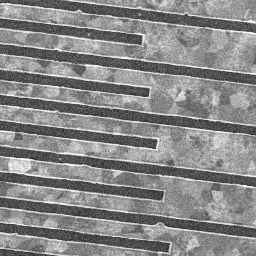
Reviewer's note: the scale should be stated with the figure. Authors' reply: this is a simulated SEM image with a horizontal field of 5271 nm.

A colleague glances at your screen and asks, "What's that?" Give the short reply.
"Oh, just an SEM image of parallel lines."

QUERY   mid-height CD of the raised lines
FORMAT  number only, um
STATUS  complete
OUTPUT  0.296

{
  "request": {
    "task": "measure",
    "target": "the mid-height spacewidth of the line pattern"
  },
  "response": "238 nm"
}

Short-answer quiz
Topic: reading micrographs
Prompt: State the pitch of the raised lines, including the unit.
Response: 0.523 µm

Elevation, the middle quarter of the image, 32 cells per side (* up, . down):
******.*.......................*
****************................
************************........
....****************************
...........*********************
..................*.************
***...................**********
************.........***********
********************************
.*******************************
........************************
.................***************
*.......................********
*********.......................
*****************...............
**************************......
......**************************
..............******************
.......................*********
*******.................********
***************........*********
********************************
...*****************************
.........***********************
...................*************
******.....................*****
**********......................
*******************.............
*****************************...
.......*************************
.................***************
.........................*******